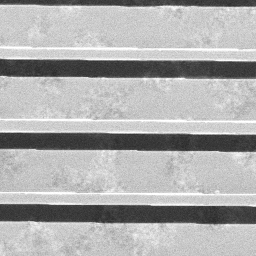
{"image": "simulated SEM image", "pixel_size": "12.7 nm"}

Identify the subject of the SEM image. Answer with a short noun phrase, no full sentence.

lines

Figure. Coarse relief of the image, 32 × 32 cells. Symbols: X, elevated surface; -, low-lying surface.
--------------------------------
XXXXXXXXXXXXXXXXXXXXXXXXXXXXXXXX
XXXXXXXXXXXXXXXXXXXXXXXXXXXXXXXX
XXXXXXXXXXXXXXXXXXXXXXXXXXXXXXXX
XXXXXXXXXXXXXXXXXXXXXXXXXXXXXXXX
XXXXXXXXXXXXXXXXXXXXXXXXXXXXXXXX
XXXXXXXXXXXXXXXXXXXXXXXXXXXXXXXX
--------------------------XXXXXX
--------------------------------
--------------------------------
XXXXXXXXXXXXXXXXXXXXXXXXXXXXXXXX
XXXXXXXXXXXXXXXXXXXXXXXXXXXXXXXX
XXXXXXXXXXXXXXXXXXXXXXXXXXXXXXXX
XXXXXXXXXXXXXXXXXXXXXXXXXXXXXXXX
XXXXXXXXXXXXXXXXXXXXXXXXXXXXXXXX
XXXXXXXXXXXXXXXXXXXXXXXXXXXXXXXX
-------------XXXXXXXXXXXXXXXXXXX
--------------------------------
--------------------------------
XXXXXXXXXXXXXXXXXXXXXXXXXXXXXXXX
XXXXXXXXXXXXXXXXXXXXXXXXXXXXXXXX
XXXXXXXXXXXXXXXXXXXXXXXXXXXXXXXX
XXXXXXXXXXXXXXXXXXXXXXXXXXXXXXXX
XXXXXXXXXXXXXXXXXXXXXXXXXXXXXXXX
XXXXXXXXXXXXXXXXXXXXXXXXXXXXXXXX
-----XXXXXXXXXXXXXXXXXXXXXXXXXXX
--------------------------------
--------------------------------
XXXXXXXXXXXXXXXXXXXXXXXXXXXXXXXX
XXXXXXXXXXXXXXXXXXXXXXXXXXXXXXXX
XXXXXXXXXXXXXXXXXXXXXXXXXXXXXXXX
XXXXXXXXXXXXXXXXXXXXXXXXXXXXXXXX